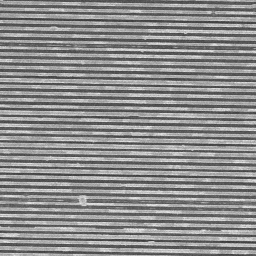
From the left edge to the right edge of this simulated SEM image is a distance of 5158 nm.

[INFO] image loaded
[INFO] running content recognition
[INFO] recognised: parallel lines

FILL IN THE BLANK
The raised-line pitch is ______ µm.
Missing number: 0.13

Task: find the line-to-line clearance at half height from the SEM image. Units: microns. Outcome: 0.0655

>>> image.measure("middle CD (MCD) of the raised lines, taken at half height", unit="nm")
65.5